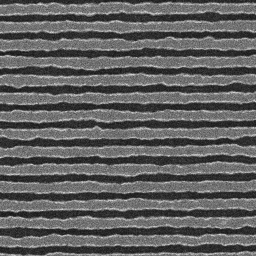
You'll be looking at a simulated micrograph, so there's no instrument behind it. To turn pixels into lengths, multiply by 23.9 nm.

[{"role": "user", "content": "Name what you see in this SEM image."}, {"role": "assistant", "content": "parallel lines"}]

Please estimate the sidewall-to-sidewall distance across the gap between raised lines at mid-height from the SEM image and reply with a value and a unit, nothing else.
188 nm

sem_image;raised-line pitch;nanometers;426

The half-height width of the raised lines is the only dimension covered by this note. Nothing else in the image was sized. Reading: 0.243 microns